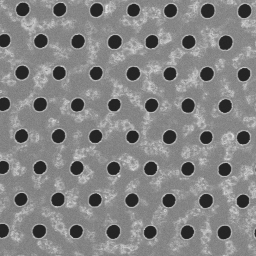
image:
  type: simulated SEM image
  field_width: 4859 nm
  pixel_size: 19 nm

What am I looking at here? a regular array of holes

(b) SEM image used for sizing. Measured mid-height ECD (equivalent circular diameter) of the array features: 0.257 um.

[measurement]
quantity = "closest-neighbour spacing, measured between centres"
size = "693 nm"